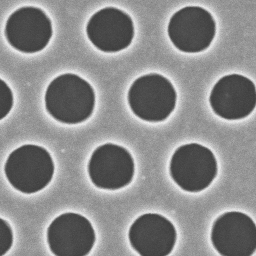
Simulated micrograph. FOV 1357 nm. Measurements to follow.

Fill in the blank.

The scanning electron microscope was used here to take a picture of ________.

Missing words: a regular array of holes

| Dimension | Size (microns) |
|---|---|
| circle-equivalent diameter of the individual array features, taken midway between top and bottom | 0.251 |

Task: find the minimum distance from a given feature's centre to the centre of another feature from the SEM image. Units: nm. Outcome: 420